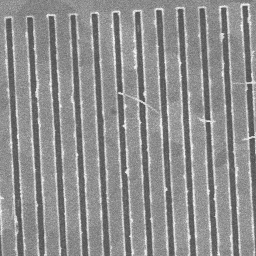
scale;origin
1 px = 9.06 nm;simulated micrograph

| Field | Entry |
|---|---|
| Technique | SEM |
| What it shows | parallel lines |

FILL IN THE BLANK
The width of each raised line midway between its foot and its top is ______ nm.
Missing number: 133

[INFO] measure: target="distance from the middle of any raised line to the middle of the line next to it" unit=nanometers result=195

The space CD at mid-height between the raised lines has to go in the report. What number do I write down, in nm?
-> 62.2